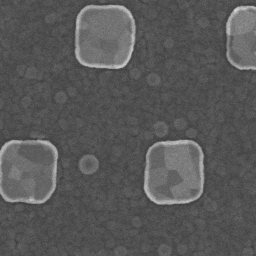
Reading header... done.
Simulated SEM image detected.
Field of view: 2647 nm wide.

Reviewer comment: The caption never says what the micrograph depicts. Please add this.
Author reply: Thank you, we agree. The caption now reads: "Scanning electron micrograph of raised bodies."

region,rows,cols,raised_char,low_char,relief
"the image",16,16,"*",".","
......**.......*
.....***......**
.....***......**
.....***......**
................
................
................
................
................
***......****...
***......****...
***......****...
.**.......**....
................
................
................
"